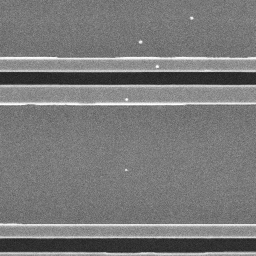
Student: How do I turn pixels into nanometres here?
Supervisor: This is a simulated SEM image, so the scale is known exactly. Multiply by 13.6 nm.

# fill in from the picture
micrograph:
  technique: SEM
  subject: lines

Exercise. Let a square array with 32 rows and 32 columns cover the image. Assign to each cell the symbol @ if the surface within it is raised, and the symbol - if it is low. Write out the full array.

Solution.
--------------------------------
--------------------------------
--------------------------------
--------------------------------
--------------------------------
--------------------------------
--------------------------------
@@@@@@@@@@@@@@@@@@@@@@@@@@@@@@@@
@@@@@@@@@@@@@@@@@@@@@@@@@@@@@@@@
--------------------------------
--------------------------------
@@@@@@@@@@@@@@@@@@@@@@@@@@@@@@@@
@@@@@@@@@@@@@@@@@@@@@@@@@@@@@@@@
--------------------------------
--------------------------------
--------------------------------
--------------------------------
--------------------------------
--------------------------------
--------------------------------
--------------------------------
--------------------------------
--------------------------------
--------------------------------
--------------------------------
--------------------------------
--------------------------------
--------------------------------
@@@@@@@@@@@@@@@@@@@@@@@@@@@@@@@@
@@@@@@@@@@@@@@@@@@@@@@@@@@@@@@@@
--------------------------------
--------------------------------